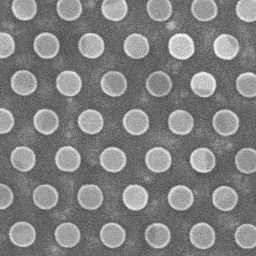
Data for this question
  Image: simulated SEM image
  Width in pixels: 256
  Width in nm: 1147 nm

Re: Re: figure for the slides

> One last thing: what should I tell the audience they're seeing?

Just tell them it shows a regular array of raised bodies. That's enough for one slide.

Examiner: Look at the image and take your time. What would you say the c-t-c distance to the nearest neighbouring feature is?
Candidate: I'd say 0.196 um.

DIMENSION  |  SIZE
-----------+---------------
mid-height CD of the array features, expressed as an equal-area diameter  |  0.11 microns